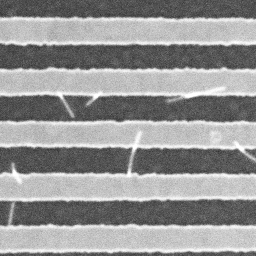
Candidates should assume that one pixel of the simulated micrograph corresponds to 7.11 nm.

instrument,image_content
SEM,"lines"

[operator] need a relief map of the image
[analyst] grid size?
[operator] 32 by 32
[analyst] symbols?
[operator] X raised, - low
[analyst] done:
--------------------------------
--------------------------------
XXXXXXXXXXXXXXXXXXXXXXXXXXXXXXXX
XXXXXXXXXXXXXXXXXXXXXXXXXXXXXXXX
XXXXXXXXXXXXXXXXXXXXXXXXXXXXXXXX
--X----X--------------------X---
--------------------------------
--------------------------------
--------------------------------
XXXXXXXXXXXXXXXXXXXXXXXXXXXXXXXX
XXXXXXXXXXXXXXXXXXXXXXXXXXXXXXXX
XXXXXXXXXXXXXXXXXXXXXXXXXXXXXXXX
--------------------------------
--------------------------------
--------------------------------
XXXXXXXXXXXXXXXXXXXXXXXXXXXXXXXX
XXXXXXXXXXXXXXXXXXXXXXXXXXXXXXXX
XXXXXXXXXXXXXXXXXXXXXXXXXXXXXXXX
-------------------------X-XXXXX
--------------------------------
--------------------------------
--------------------------------
XXXXXXXXXXXXXXXXXXXXXXXXXXXXXXXX
XXXXXXXXXXXXXXXXXXXXXXXXXXXXXXXX
XXXXXXXXXXXXXXXXXXXXXXXXXXXXXXXX
--------------------------------
--------------------------------
--------------------------------
XXXXXXXXXXXXXXXXXXXXXXXXXXXXXXXX
XXXXXXXXXXXXXXXXXXXXXXXXXXXXXXXX
XXXXXXXXXXXXXXXXXXXXXXXXXXXXXXXX
--------------------------------